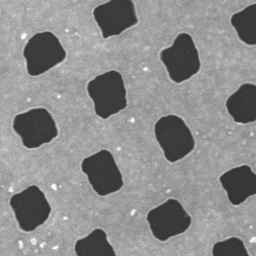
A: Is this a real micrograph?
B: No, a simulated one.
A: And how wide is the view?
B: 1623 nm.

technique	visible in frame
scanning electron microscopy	a regular array of holes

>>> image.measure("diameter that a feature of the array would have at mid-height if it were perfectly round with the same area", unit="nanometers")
257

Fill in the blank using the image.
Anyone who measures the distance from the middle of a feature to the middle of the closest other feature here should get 0.501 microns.